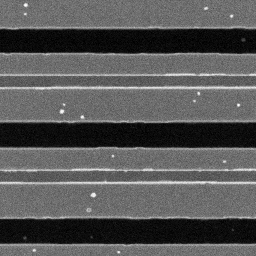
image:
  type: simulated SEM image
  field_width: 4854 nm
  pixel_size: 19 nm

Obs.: lines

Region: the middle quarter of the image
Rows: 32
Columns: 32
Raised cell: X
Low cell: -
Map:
XXXXXXXXXXXXXXXXXXXXXXXXXXXXXXXX
XXXXXXXXXXXXXXXXXXXXXXXXXXXXXXXX
XXXXXXXXXXXXXXXXXXXXXXXXXXXXXXXX
XXXXXXXXXXXXXXXXXXXXXXXXXXXXXXXX
XXXXXXXXXXXXXXXXXXXXXXXXXXXXXXXX
XXXXXXXXXXXXXXXXXXXXXXXXXXXXXXXX
XXXXXXXXXXXXXXXXXXXXXXXXXXXXXXXX
XXXXXXXXXXXXXXXXXXXXXXXXXXXXXXXX
XXXXXXXXXXXXXXXXXXXXXXXXXXXXXXXX
XXXXXXXXXXXXXXXXXXXXXXXXXXXXXXXX
XXXXXXXXXXXXXXXXXXXXXXXXXXXXXXXX
XXXXXXXXXXXXXXXXXXXXXXXXXXXXXXXX
XXXXXXXXXXXXXXXXXXXXXXXXXXXXXXXX
XXXXXXXXXXXXXXXXXXXXXXXXXXXXXXXX
-XX---------XXXXXX--XXXXXXX-----
--------------------------------
--------------------------------
--------------------------------
--------------------------------
--------------------------------
--------------------------------
XXXXXXXXXXXXXXXXXXXXXXXXXXXXXXXX
XXXXXXXXXXXXXXXXXXXXXXXXXXXXXXXX
XXXXXXXXXXXXXXXXXXXXXXXXXXXXXXXX
XXXXXXXXXXXXXXXXXXXXXXXXXXXXXXXX
XXXXXXXXXXXXXXXXXXXXXXXXXXXXXXXX
XXXXXXXXXXXXXXXXXXXXXXXXXXXXXXXX
XXXXXXXXXXXXXXXXXXXXXXXXXXXXXXXX
XXXXXXXXXXXXXXXXXXXXXXXXXXXXXXXX
XXXXXXXXXXXXXXXXXXXXXXXXXXXXXXXX
XXXXXXXXXXXXXXXXXXXXXXXXXXXXXXXX
XXXXXXXXXXXXXXXXXXXXXXXXXXXXXXXX